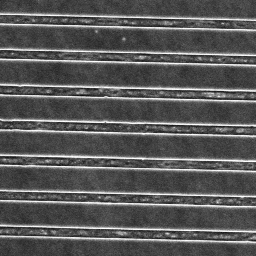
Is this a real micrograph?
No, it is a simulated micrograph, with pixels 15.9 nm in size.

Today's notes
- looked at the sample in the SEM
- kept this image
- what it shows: parallel lines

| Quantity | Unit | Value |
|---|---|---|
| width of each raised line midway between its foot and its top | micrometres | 0.409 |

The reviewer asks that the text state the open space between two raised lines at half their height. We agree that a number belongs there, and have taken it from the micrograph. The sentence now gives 152 nanometers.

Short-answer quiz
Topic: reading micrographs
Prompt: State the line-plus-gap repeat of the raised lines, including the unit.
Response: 563 nanometres